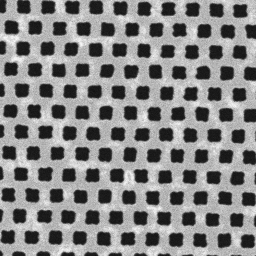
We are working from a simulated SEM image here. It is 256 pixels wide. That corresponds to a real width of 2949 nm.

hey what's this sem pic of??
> a regular array of holes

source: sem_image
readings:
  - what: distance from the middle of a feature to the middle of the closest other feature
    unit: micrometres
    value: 0.272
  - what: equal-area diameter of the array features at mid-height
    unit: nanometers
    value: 175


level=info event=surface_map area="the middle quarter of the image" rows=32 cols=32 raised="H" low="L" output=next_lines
LHHLLLHHHLLLHHHLLLHHHLLLHHHHLHHH
LHHLLLHHHLLLLHHLLLLHHLLLLHHLLLLH
HHHLLLHHHLLLHHHLLLHHHLLLLHHLLLLH
HHHHHHHHHHLHHHHLLLHHHHLLHHHLLLLH
HHHHHHHHHHHHHHHHHHHHHHHHHHHHHHHH
LLLHHHHLLHHHLLLHHHHHLHHHHHHHHHHH
LLLHHHLLLHHHLLLHHHLLLLHHLLLHHHLL
LLLHHHLLLHHHLLLHHHLLLHHHLLLHHHLL
LLLHHHLLLHHHLLLHHHLLLHHHLLLHHHLL
HHHHHHHHHHHHHHHHHHHHHHHHHHHHHHHH
HHHLLLHHHHLHHHHLLLHHHHHHHHHHHHHH
HHHLLLHHHLLLHHHLLLHHHLLLHHHLLLHH
HHHLLLHHHLLLHHHLLLHHHLLLHHHLLLHH
HHHLLLHHHLLLHHHLLLHHHLLLHHHLLLHH
HHHHHHHHHHHHHHHHHHHHHHHHHHHHHHHH
HHHHHHHHHHHHHHHHHHHHHHHHHHHHHHHH
LLLHHHLLLHHHLLLHHHLLLHHHLLLHHHLL
LLLHHHLLLHHHLLLHHHLLLHHHLLLHHHLL
LLLHHHLLLHHHLLLHHHLLLHHHLLLHHHLL
HHHHHHHHHHHHHHHHHHHHHHHHHHHHHHLL
HHHHHHHHHHHHHHHHHHHHHHHHHHHHHHHH
HHHLLLHHHLLLHHHLLLHHHLLLHHHLLLHH
HHHLLLHHHLLLHHHLLLHHHLLLHHLLLLHH
HHHLLLHHHLLLHHHLLLHHHLLLHHHLLLHH
HHHHHHHHHLHHHHHHLLHHHLLLHHHLLLHH
HHHHHHHHHHHHHHHHHHHHHHHHHHHHHHHH
LLLHHHLLLHHHLLLHHHLLLHHHHHHHHHLL
LLLHHLLLLHHLLLLHHHLLLHHHLLLHHHLL
LLLHHLLLLHHLLLLHHHLLLHHHLLLHHHLL
LLHHHHLLHHHHLLLHHHLLLHHHLLLHHHLL
HHHHHHHHHHHHHHHHHHHHHHHHHHHHHHHH
HHHLLHHHHLLHHHHHHHHHHHHHHHHHHHHH